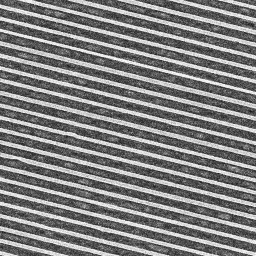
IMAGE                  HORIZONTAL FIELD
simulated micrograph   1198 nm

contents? parallel lines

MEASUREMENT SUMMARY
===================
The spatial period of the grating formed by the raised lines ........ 0.056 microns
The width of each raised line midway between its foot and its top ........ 0.0148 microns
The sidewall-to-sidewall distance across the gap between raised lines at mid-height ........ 40.3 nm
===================